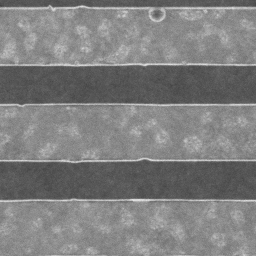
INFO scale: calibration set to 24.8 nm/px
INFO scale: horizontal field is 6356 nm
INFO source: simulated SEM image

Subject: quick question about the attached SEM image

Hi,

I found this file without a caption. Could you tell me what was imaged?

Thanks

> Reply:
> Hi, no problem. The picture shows one or a few lines or trenches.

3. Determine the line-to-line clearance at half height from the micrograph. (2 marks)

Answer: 1390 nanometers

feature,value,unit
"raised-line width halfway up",0.999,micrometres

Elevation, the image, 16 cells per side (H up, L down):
LLLLLLLLLHHLLLLL
LLLLLLLLLLLLLLLL
LLLLLLLLLLLLLLLL
LLLLLLLLLLLLLLLL
HHHHHHHHHHHHHHHH
HHHHHHHHHHHHHHHH
HHHHHHHHHHHHHHHH
LLLLLLLLLLLLLLLL
LLLLLLLLLLLLLLLL
LLLLLLLLLLLLLLLL
HHHHHHHHHHHHHHHH
HHHHHHHHHHHHHHHH
HHLHLLLLLLLLHHHH
LLLLLLLLLLLLLLLL
LLLLLLLLLLLLLLLL
LLLLLLLLLLLLLLLL